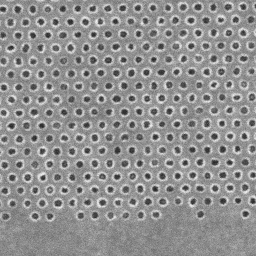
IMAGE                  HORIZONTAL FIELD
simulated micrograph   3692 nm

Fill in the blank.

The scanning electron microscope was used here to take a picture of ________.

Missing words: a regular array of holes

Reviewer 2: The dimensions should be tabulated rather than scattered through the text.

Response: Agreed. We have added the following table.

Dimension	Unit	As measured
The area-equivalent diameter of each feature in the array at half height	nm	104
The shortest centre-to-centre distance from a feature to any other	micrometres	0.209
